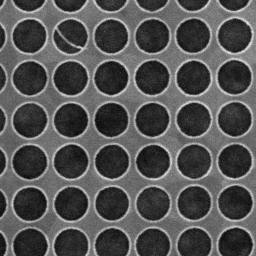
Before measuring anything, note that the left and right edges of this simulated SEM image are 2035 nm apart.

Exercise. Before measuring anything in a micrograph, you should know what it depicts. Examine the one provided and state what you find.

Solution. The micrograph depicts a regular array of holes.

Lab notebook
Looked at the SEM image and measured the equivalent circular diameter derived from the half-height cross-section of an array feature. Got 279 nm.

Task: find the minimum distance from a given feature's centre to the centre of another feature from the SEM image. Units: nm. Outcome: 325